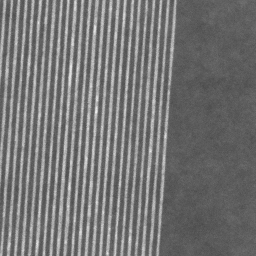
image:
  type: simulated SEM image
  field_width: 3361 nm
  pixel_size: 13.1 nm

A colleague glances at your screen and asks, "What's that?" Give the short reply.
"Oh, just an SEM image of parallel lines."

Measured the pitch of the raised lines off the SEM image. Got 0.093 microns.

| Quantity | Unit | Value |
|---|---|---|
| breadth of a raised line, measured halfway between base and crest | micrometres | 0.0262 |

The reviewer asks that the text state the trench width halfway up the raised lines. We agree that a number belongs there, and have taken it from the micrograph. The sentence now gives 67.1 nm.